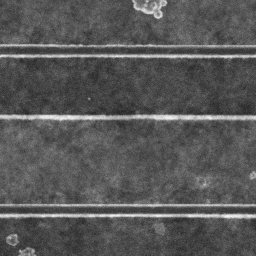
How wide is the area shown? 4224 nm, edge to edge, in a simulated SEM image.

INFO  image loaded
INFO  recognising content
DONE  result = lines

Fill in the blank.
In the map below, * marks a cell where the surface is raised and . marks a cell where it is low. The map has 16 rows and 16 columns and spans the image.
****************
****************
****************
................
................
................
................
****************
****************
****************
****************
****************
****************
................
................
................